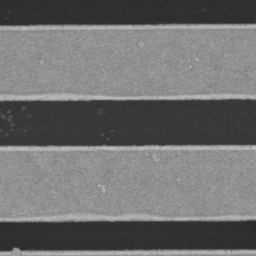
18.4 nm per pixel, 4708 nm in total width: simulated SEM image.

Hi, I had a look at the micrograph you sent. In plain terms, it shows lines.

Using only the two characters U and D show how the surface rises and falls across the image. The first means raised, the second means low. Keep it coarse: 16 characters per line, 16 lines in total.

DDDDDDDDDDDDDDDD
DDDDDDDDDDDDDDDD
UUUUUUUUUUUUUUUU
UUUUUUUUUUUUUUUU
UUUUUUUUUUUUUUUU
UUUUUUUUUUUUUUUU
DDDDDDDDDDDDDDDD
DDDDDDDDDDDDDDDD
DDDDDDDDDDDDDDDD
UUUUUUUUUUUUUUUU
UUUUUUUUUUUUUUUU
UUUUUUUUUUUUUUUU
UUUUUUUUUUUUUUUU
UUUUUUUUUUUUUUUU
DDDDDDDDDDDDDDDD
DDDDDDDDDDDDDDDD